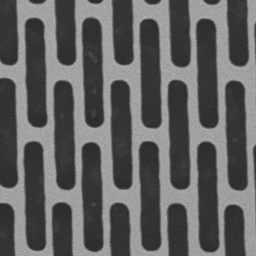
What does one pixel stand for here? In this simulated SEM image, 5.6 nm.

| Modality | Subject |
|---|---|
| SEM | a regular array of holes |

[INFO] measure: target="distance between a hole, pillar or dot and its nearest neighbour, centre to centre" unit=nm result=321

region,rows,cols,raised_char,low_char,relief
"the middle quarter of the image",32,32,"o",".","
ooooo.....ooooooooo.....oooo...o
ooooo.....ooooooooo.....oooooooo
ooooo.....ooooooooo.....oooooooo
ooooo.....ooooooooo.....oooooooo
.oooo.....oo...oooo.....oo....oo
..ooo.....oo....ooo.....oo.....o
..ooo.....oo....ooo.....oo.....o
..ooo.....oo.....oo.....oo.....o
...oo.....oo.....oo.....oo.....o
...oo.....o.....ooo......o.....o
...oo.....oo.....oo.....oo.....o
...oo.....oo.....oo......o.....o
...oo.....oo.....oo.....oo.....o
...oo.....oo.....oo.....oo.....o
...oo.....oo.....oo.....oo.....o
...ooo...ooo.....ooo....oo.....o
...ooooooooo.....ooooooooo.....o
...ooooooooo.....ooooooooo.....o
...ooooooooo.....ooooooooo.....o
...ooooooooo.....ooo..oooo.....o
...oo....ooo.....oo....ooo.....o
...o.....ooo.....oo.....oo.....o
...o.....ooo.....oo.....oo......
...o.....ooo.....oo.....oo......
...oo....ooo.....oo.....oo......
...oo....ooo.....oo.....oo......
...o.....ooo.....oo.....oo......
...o.....ooo.....oo.....oo......
...o......oo.....oo.....oo......
...o......oo.....oo.....ooo.....
...o......ooo....oo.....ooo....o
oooo......ooooooooo.....oooooooo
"